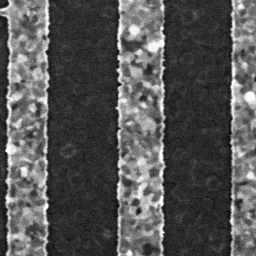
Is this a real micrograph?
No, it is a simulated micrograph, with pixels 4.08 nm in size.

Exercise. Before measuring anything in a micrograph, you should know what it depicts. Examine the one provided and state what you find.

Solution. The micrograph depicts one or a few lines or trenches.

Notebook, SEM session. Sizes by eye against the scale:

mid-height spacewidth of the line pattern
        290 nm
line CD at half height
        167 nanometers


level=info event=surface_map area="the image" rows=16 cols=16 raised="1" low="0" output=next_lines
1110000111000001
0110000011000001
0110000111000001
0110000111000001
0110000111000001
0110000011000001
0110000111000001
1110000111000001
1110000111000011
1110000111000001
0110000111000001
1110000111000001
1110000111000001
0110000111000011
0110000111000001
0110000111000001